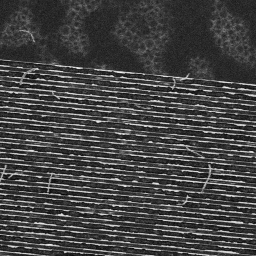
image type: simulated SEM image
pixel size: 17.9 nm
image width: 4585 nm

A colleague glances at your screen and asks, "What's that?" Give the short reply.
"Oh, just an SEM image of parallel lines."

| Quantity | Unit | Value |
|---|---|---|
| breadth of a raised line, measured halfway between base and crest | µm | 0.0958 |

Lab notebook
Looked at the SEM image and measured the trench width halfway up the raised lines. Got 4.85 pixels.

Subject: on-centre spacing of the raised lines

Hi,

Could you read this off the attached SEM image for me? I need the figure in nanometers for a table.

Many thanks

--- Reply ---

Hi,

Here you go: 183